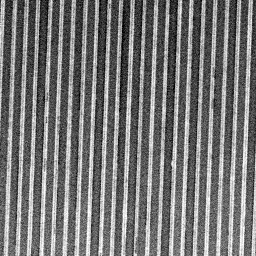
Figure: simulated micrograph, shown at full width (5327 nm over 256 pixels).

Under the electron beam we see parallel lines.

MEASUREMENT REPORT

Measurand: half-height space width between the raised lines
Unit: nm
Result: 179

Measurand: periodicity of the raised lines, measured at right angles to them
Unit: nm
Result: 245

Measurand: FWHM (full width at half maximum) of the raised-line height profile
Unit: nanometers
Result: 59.8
